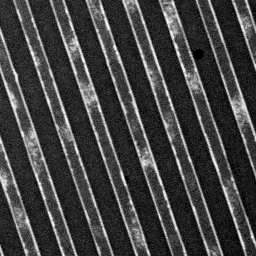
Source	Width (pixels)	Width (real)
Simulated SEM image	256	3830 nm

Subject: parallel lines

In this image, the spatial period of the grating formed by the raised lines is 518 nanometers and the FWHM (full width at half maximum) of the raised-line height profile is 12.6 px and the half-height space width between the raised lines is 0.323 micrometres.